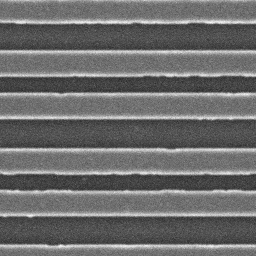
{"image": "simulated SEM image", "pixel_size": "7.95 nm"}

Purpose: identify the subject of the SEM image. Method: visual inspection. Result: lines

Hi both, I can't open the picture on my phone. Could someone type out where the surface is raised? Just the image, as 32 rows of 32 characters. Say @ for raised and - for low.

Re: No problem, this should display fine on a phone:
@@@@@@@@@@@@@@@@@@@@@@@@@@@@@@@@
@@@@@@@@@@@@@@@@@@@@@@@@@@@@@@@@
@@@@@@@@@@@@@@@@@@@@@@@@@@@@@@@@
--------------------------------
--------------------------------
--------------------------------
@@@@@@@@@@@@@@@@@@@@@@@@@@@@@@@@
@@@@@@@@@@@@@@@@@@@@@@@@@@@@@@@@
@@@@@@@@@@@@@@@@@@@@@@@@@@@@@@@@
--------------------------------
--------------------------------
--------------------------------
@@@@@@@@@@@@@@@@@@@@@@@@@@@@@@@@
@@@@@@@@@@@@@@@@@@@@@@@@@@@@@@@@
@@@@@@@@@@@@@@@@@@@@@@@@@@@@@@@@
--------------------------------
--------------------------------
--------------------------------
--------------------------------
@@@@@@@@@@@@@@@@@@@@@@@@@@@@@@@@
@@@@@@@@@@@@@@@@@@@@@@@@@@@@@@@@
@@@@@@@@@@@@@@@@@@@@@@@@@@@@@@@@
--------------------------------
--------------------------------
@@@@@@@@@@@@@@@@@@@@@@@@@@@@@@@@
@@@@@@@@@@@@@@@@@@@@@@@@@@@@@@@@
@@@@@@@@@@@@@@@@@@@@@@@@@@@@@@@@
--------------------------------
--------------------------------
--------------------------------
--------------------------------
@@@@@@@@@@@@@@@@@@@@@@@@@@@@@@@@